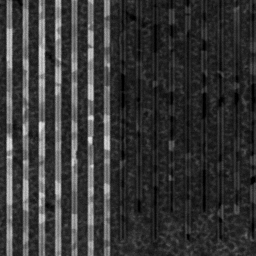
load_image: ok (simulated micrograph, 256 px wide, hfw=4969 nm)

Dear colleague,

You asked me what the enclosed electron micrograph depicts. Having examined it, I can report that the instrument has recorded parallel lines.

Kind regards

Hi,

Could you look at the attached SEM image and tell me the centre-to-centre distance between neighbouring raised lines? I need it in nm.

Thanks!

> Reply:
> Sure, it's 315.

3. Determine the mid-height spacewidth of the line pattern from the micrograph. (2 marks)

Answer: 247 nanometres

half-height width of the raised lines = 0.0703 um